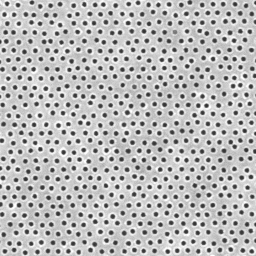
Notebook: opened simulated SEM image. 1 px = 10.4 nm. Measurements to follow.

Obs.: a regular array of holes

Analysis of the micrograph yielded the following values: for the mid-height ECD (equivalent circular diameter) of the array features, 4.91 px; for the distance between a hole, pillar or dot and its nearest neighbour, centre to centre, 95.7 nanometres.